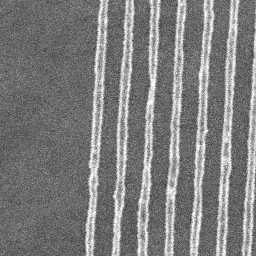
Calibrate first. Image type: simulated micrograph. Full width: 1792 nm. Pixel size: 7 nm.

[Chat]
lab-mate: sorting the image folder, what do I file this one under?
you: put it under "parallel lines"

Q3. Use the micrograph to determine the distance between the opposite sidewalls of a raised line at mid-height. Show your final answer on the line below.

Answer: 51.5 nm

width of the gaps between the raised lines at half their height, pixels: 18.5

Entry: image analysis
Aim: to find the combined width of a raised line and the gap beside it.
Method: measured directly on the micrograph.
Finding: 183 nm